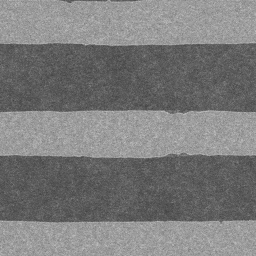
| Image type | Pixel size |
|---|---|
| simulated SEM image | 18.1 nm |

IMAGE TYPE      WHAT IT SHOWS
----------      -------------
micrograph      one or a few lines or trenches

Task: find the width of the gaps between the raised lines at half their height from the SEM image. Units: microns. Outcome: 1.2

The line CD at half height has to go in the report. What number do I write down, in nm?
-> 785